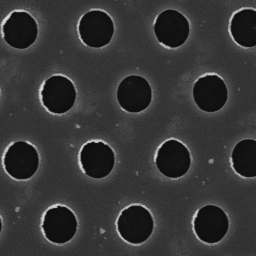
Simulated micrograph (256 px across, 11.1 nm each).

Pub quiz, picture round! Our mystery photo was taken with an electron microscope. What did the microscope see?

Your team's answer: a regular array of holes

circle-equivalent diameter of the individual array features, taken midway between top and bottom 398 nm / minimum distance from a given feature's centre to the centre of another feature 0.833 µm